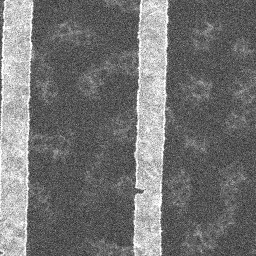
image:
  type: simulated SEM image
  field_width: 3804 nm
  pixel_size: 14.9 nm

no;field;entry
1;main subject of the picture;one or a few lines or trenches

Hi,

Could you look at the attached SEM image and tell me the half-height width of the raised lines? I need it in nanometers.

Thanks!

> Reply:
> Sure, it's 394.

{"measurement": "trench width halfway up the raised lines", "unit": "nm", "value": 1610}